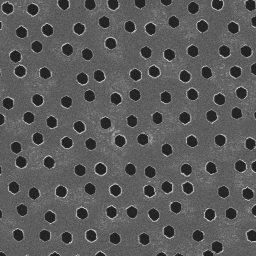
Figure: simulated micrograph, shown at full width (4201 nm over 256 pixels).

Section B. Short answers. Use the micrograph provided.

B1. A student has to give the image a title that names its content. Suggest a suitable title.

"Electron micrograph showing a regular array of holes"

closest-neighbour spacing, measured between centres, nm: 345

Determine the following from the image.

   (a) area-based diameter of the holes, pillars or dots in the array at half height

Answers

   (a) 184 nanometers